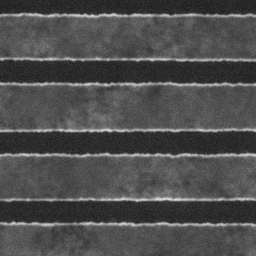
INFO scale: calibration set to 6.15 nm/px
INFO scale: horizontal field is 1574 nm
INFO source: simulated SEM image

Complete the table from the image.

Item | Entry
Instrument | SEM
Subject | lines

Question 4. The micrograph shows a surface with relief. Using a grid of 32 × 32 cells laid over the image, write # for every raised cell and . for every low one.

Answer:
................................
................................
################################
################################
################################
################################
################################
.........##..#...#.#..##########
................................
................................
#########.###.########..#.######
################################
################################
################################
################################
################################
................................
................................
................................
################################
################################
################################
################################
################################
################################
................................
................................
................................
################################
################################
################################
################################